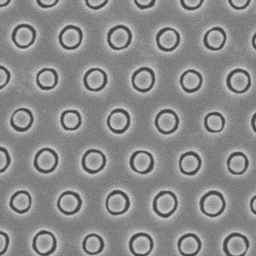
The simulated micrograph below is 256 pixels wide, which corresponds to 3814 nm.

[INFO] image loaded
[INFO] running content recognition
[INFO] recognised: a regular array of ring-shaped grooves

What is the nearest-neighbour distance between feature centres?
694 nanometers